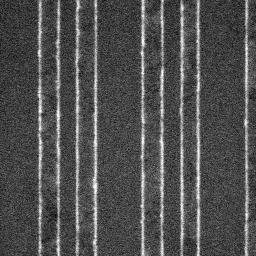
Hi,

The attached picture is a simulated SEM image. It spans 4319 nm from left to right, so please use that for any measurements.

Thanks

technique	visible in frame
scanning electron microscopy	lines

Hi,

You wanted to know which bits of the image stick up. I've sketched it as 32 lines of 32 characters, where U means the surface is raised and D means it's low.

DDDDDUUDDDUUDDDDDDUUDDDUUDDDDDDU
DDDDDUUDDDUUDDDDDDUUDDDUUDDDDDDU
DDDDDUUDDDUUDDDDDDUUDDDUUDDDDDDU
DDDDDUUDDDUUDDDDDDUUDDDUUDDDDDDU
DDDDDUUDDDUUDDDDDDUUDDDUUDDDDDDU
DDDDDUUDDDUUDDDDDDUUDDDUUDDDDDDU
DDDDDUUDDDUUDDDDDDUUDDDUUDDDDDDU
DDDDDUUDDDUUDDDDDDUUDDDUUDDDDDDU
DDDDDUUDDDUUDDDDDDUUDDDUUDDDDDDU
DDDDDUUDDDUUDDDDDDUUDDDUUDDDDDDU
DDDDDUUDDDUUDDDDDDUUDDDUUDDDDDDU
DDDDDUUDDDUUDDDDDDUUDDDUUDDDDDDU
DDDDDUUDDDUUDDDDDDUUDDDUUDDDDDDU
DDDDDUUDDDUUDDDDDDUUDDDUUDDDDDDU
DDDDDUUDDDUUDDDDDDUUDDDUUDDDDDDU
DDDDDUUDDDUUDDDDDDUUDDDUUDDDDDDU
DDDDDUUDDDUUDDDDDDUUDDDUUDDDDDDU
DDDDDUUDDDUUDDDDDDUUDDDUUDDDDDDU
DDDDDUUDDDUUDDDDDDUUDDDUUDDDDDDU
DDDDDUUDDDUUDDDDDDUUDDDUUDDDDDDU
DDDDDUUDDDUUDDDDDDUUDDDUUDDDDDDU
DDDDDUUDDDUUDDDDDDUUDDDUUDDDDDDU
DDDDDUUDDDUUDDDDDDUUDDDUUDDDDDDU
DDDDDUUDDDUUDDDDDDUUDDDUUDDDDDDU
DDDDDUUDDDUUDDDDDDUUDDDUUDDDDDDU
DDDDDUUDDDUUDDDDDDUUDDDUUDDDDDDU
DDDDDUUDDDUUDDDDDDUUDDDUUDDDDDDU
DDDDDUUDDDUUDDDDDDUUDDDUUDDDDDDU
DDDDDUUDDDUUDDDDDDUUDDDUUDDDDDDU
DDDDDUUDDDUUDDDDDDUUDDDUUDDDDDDU
DDDDDUUDDDUUDDDDDDUUDDDUUDDDDDDU
DDDDDUUDDDUUDDDDDDUUDDDUUDDDDDDU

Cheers